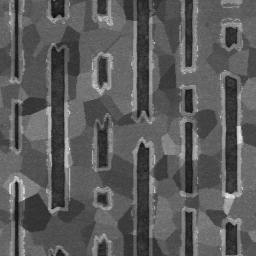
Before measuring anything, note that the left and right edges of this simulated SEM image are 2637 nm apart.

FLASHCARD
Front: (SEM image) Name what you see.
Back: parallel lines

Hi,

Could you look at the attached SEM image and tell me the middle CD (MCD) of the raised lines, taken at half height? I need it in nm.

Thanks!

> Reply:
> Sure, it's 306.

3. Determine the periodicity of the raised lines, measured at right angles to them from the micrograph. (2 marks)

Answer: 0.448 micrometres